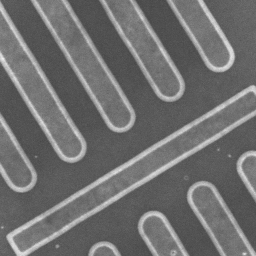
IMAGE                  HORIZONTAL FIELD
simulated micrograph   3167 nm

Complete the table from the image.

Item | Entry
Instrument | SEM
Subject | groups of lines, slits or small figures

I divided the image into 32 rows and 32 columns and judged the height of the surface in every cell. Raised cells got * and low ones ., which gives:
....****.....****....****.......
*....****.....***.....****......
*.....****....****.....****.....
**....****.....****....****.....
**.....****....****.....****....
***....****.....****....****....
****....****.....****....****...
****.....****....****.....***...
.****....****.....****.....*....
.****.....****....****..........
..****....****.....****.........
...****....****.....***.......**
...****.....****.............***
....****....****...........*****
.....***.....****.........*****.
*....****.....**........******..
*.....****............******....
**....****...........******.....
**.....***.........******.......
***.....**.......******........*
****............******........**
****..........******..........**
.***.........*****.............*
..**.......******.......***....*
.........******.........***.....
........*****...........****....
......******.............****...
....******........***....****...
...*****..........***.....****..
.******...........****....****..
..***..............***.....****.
..**.......****....****.....****